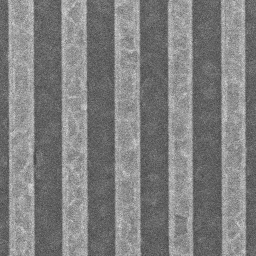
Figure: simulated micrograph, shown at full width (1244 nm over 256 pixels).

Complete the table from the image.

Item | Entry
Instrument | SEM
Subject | parallel lines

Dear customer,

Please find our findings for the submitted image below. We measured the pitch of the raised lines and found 0.258 µm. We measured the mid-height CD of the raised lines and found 106 nm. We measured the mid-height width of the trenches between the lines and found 153 nm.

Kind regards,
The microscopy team